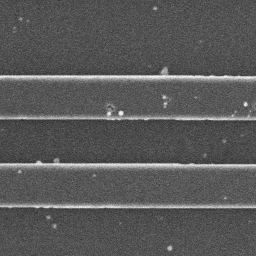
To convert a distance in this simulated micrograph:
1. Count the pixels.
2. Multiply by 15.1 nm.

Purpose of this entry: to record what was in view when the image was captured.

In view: lines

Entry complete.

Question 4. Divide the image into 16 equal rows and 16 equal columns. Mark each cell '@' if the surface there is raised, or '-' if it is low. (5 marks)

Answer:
----------------
----------------
----------------
----------------
----------------
@@@@@@@@@@@@@@@@
@@@@@@@@@@@@@@@@
----------------
----------------
----------------
@@@@@@@@@@@@@@@@
@@@@@@@@@@@@@@@@
@@@@@@@@@@@@@@@@
----------------
----------------
----------------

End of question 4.